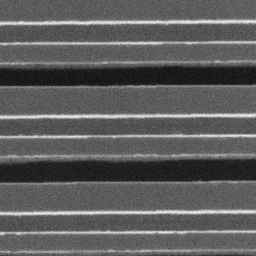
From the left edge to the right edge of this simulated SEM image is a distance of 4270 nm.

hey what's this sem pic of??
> lines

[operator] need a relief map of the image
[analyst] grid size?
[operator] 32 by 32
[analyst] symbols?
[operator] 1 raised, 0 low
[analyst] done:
11111111111111111111111111111111
11111111111111111111111111111111
11111111111111111111111111111111
11111111111111111111111111111111
11111111111111111111111111111111
11111111111111111111111111111111
11111111111111111111111111111111
11111111111111111111111111111111
00000000000000000000000000000000
00000000000000000000000000000000
00000000000000000000000000000000
11111111111111111111111111111111
11111111111111111111111111111111
11111111111111111111111111111111
11111111111111111111111111111111
11111111111111111111111111111111
11111111111111111111111111111111
11111111111111111111111111111111
11111111111111111111111111111111
11111111111111110011100000000000
00000000000000000000000000000000
00000000000000000000000000000000
00000000000000000000000000000000
11111111111111111111111111111111
11111111111111111111111111111111
11111111111111111111111111111111
11111111111111111111111111111111
11111111111111111111111111111111
11111111111111111111111111111111
11111111111111111111111111111111
11111111111111111111111111111111
11111111111111001000000000000000